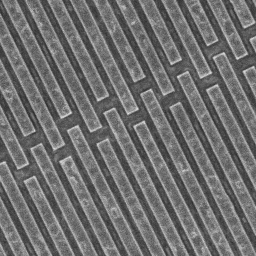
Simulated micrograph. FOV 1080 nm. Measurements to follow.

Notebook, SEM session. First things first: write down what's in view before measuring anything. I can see parallel lines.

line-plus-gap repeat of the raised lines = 0.0859 micrometres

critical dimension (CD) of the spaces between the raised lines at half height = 34 nm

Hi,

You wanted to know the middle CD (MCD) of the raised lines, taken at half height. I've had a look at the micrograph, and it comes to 53.3 nm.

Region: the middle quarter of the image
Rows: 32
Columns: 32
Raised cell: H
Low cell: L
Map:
HHLLHHHLLLHHHLLLHHHLLHHHHLLLLLLL
HHLLLHHHLLHHHHLLHHHLLLHHHLLLLLLL
HHHLLHHHLLLHHHLLLHHHLLHHHHLLLLHL
HHHLLLHHHLLHHHHLLHHHLLLHHHLLHHHH
LHHHLLHHHLLLHHHLLLLLLLLHHHHLLHHH
LHHHLLLHHHLLHHHHLLLLLLLLHHHLLHHH
LHHHHLLHHHLLLHHHLLLLLLLLHHHLLLHH
LLHHHLLLHHHLLHHHHLLHHHLLLLLLLLHH
LLHHHHLLHHLLLLHHHLLLHHHLLLLLLLLH
HLLHHHLLLLLLLLHHHHLLHHHLLLLLLLLH
HLLHHHHLLLLLLLLHHHLLLHHHLLLHHHLL
HHLLHHHLLLLLHLLHHHLLLHHHLLLHHHLL
HHLLHHHHLLHHHLLLLLLLLLHHHLLHHHHL
LLLLLHHHLLLHHHLLLLLLLLHHHLLLHHHL
LLLLLHHHHLLHHHLLLLLLLLLHHHLLHHHH
LLLLLLHHHLLLHHHLLLHHHLLHHHLLLHHH
LHHHLLHHLLLLHHHLLLHHHLLLHHHLLHHH
LHHHHLLLLLLLLHHHLLHHHHLLHHHLLLHH
LLHHHLLLLLLLLHHHLLLHHHLLLHHHLLHH
LLHHHHLLLHHLLHHHHLLHHHHLLHHHLLLH
LLLHHHLLHHHHLLHHHLLLHHHLLLHHHLLH
LLLHHHHLLHHHLLHHHHLLHHHHLLHHHLLL
LLLLHHHLLHHHHLLHHHLLLHHHLLLHHHLL
LHLLHHHHLLHHHLLHHHHLLHHHHLLHHHLL
HHLLLHHHLLHHHHLLHHHLLLHHHLLLHHHL
HHHLLHHHHLLHHHLLHHHHLLHHHHLLHHHL
HHHLLLHHHLLHHHHLLHHHLLLHHHLLLHHH
LHHHLLHHHHLLHHHLLHHHHLLHHHHLLHHH
LHHHLLLHHHLLHHHHLLHHHHLLHHHLLLHH
LLHHHLLHHHHLLHHHLLHHHHLLHHHHLLHH
LLHHHLLLHHHLLHHHHLLHHHLLLHHHLLLH
LLLHHHLLHHHHLLHHHLLHHHHLLHHHHLLH